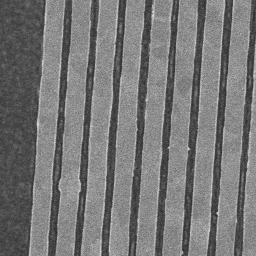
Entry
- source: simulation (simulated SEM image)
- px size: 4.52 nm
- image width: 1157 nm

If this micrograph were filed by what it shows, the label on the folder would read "parallel lines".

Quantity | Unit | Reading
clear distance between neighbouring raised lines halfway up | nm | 34.9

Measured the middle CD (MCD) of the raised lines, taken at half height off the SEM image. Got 18.3 pixels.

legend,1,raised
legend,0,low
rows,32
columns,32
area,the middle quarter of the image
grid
01111100111100011110011111001111
01111100111100011110011111001111
01111100111100111110011111001111
01111000111100111110011111001111
01111000111100111100011111001111
01111001111100111100011110001111
01111001111100111100011110011111
01111001111100111100011110011111
11111001111100111100011110011111
11111001111100111100011110011111
11111001111100111100011110011111
11111001111100111100011110011111
11111001111100111100011110011110
11111001111000111100111110011110
11111001111000111100111110011110
11111001111000111100111110011110
11111011111001111100111100011110
11111011111001111100111100011110
11111011111001111100111100011110
11110011111001111100111100011110
11110011111001111100111100111110
11110011111001111100111110111110
11110011111001111100111110111110
11110011111001111100111100111110
11110011111001111101111100111110
11110011110001111000111100111110
11110011110001111000111100111110
11110011110001111000111100111100
11110011110001111001111100111100
11110011110001111001111100111100
11110011110001111001111100111100
11110011110011111001111100111100